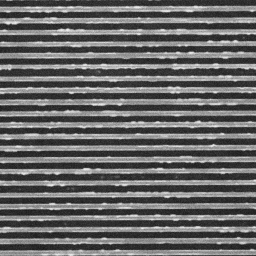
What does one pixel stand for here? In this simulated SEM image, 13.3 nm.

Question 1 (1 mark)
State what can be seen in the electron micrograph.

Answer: parallel lines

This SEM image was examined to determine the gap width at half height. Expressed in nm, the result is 89.6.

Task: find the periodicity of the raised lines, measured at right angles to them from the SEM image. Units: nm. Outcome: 154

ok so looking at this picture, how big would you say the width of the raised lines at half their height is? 0.0564 micrometres